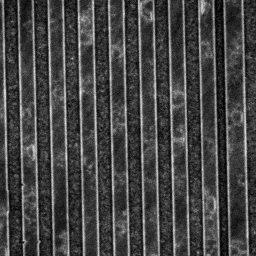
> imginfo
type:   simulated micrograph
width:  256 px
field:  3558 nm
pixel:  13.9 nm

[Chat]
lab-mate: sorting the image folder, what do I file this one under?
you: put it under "parallel lines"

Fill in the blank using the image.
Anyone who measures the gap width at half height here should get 202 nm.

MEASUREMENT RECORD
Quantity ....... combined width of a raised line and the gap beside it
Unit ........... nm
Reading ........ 412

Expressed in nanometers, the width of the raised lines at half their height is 214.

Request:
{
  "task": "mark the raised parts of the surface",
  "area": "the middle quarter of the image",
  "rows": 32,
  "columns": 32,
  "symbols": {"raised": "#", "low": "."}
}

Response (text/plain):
....####....###....####....###..
....####....###....####....###..
....####....###....####....###..
....####....###....####....###..
....####....###....####....###..
....####....###....####....###..
....####....###....####....###..
....####....###....####....###..
....####....###....####....###..
....####....###....####....###..
....####....###....####....###..
....####....###....####....###..
....####....###....####....###..
....####....###....####....###..
....####....###....####....####.
....####....###....####....####.
....####....###....####....####.
....####....###.....###....####.
#...####....###.....###....####.
#...####....###.....###....####.
#...####....###.....###....####.
#...####....####....###....####.
#...####....####....###....####.
#...####....####....###....####.
#....###....####....###....####.
#....###....####....###....####.
#....###....####....###....####.
#....###....####....###....####.
#....###....####....###....####.
#....###....####....###....####.
#....###....####....###....####.
#....###....####....###....####.